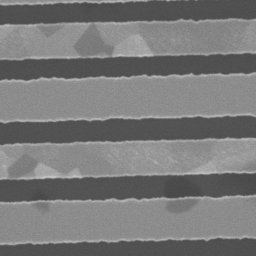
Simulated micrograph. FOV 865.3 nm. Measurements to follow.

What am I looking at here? lines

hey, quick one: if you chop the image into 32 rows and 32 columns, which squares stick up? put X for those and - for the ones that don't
XXXXX---------------------------
--------------------------------
----------------------XX-XXXXXXX
XXXXXXXXXXXXXXXXXXXXXXXXXXXXXXXX
XXXXXXXXXXXXXXXXXXXXXXXXXXXXXXXX
XXXXXXXXXXXXXXXXXXXXXXXXXXXXXXXX
XXXXXXXXXXXXXXXXXXXXXXXXXXXXXXXX
--------------------------------
--------------------------------
-----------------XXXXXXXXXXXXXXX
XXXXXXXXXXXXXXXXXXXXXXXXXXXXXXXX
XXXXXXXXXXXXXXXXXXXXXXXXXXXXXXXX
XXXXXXXXXXXXXXXXXXXXXXXXXXXXXXXX
XXXXXXXXXXXXXXXXXXXXXXXXXXXXXXXX
XXXXXXXXXXXXXXXXXXXXXXXXXXXX----
--------------------------------
--------------------------------
-------------------------XXXXXXX
XXXXXXXXXXXXXXXXXXXXXXXXXXXXXXXX
XXXXXXXXXXXXXXXXXXXXXXXXXXXXXXXX
XXXXXXXXXXXXXXXXXXXXXXXXXXXXXXXX
XXXXXXXXXXXXXXXXXXXXXXXXXXXXXXXX
--------------------------------
--------------------------------
-------------------------------X
XXXXXXXXXXXXXXXXXXXXXXXXXXXXXXXX
XXXXXXXXXXXXXXXXXXXXXXXXXXXXXXXX
XXXXXXXXXXXXXXXXXXXXXXXXXXXXXXXX
XXXXXXXXXXXXXXXXXXXXXXXXXXXXXXXX
XXXXXXXXXXXXXXXXXXXXXXXXXXXXXXXX
XX--X---------------------------
--------------------------------